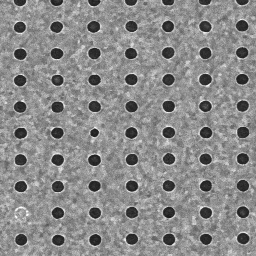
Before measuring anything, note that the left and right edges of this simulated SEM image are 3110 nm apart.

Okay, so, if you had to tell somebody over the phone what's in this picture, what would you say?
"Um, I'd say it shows a regular array of holes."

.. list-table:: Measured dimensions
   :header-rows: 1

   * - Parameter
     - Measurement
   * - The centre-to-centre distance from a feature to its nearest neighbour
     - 0.322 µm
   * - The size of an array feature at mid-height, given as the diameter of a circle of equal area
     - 12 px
